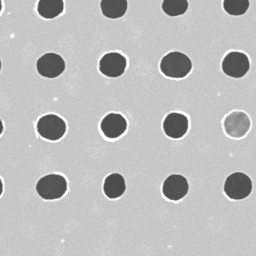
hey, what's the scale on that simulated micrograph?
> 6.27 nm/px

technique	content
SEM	a regular array of holes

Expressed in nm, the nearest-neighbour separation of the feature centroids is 378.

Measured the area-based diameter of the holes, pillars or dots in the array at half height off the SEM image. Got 166 nm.